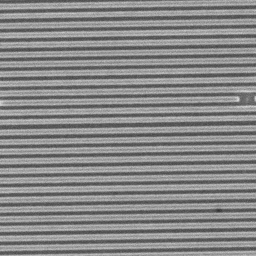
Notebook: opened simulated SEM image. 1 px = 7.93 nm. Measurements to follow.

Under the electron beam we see parallel lines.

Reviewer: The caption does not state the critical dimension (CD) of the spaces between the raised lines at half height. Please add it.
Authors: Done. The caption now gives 39.6 nanometers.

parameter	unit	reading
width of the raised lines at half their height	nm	38.7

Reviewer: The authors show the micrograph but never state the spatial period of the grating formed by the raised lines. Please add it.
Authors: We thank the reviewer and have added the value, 9.66 px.